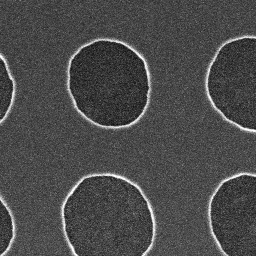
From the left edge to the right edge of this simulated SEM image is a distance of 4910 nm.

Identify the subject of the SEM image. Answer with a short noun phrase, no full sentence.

holes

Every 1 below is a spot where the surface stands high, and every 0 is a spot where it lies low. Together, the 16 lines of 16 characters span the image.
1111111111111111
1111111111111111
1111111111111110
1111100001111100
0111000001111000
0111000001111000
0111100001111000
1111110011111100
1111111111111111
1111111111111111
1111111111111111
1111100011111100
1111000001111000
0111000001111000
0111000000111000
1111100001111100